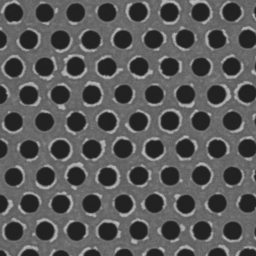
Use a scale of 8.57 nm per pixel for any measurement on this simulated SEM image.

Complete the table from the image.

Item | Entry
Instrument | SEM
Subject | a regular array of holes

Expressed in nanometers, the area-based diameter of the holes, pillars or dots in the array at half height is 158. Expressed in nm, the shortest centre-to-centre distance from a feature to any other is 264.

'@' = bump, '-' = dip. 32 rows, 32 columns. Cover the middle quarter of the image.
@----@@@-----@@@@----@@@-----@@@
@----@@@@----@@@@----@@@-----@@@
@@--@@@@@---@@@@@@--@@@@@---@@@@
@@@@@@@@@@@@@@@@@@@@@@@@@@@@@@@@
@@@@@@@@@@@@@@@@@@@@@@@@@@@@@@@@
@@@@@@--@@@@@@--@@@@@---@@@@@--@
-@@@@----@@@@----@@@-----@@@----
-@@@@----@@@-----@@@-----@@@----
-@@@@----@@@@----@@@-----@@@----
@@@@@---@@@@@@--@@@@@---@@@@@---
@@@@@@@@@@@@@@@@@@@@@@@@@@@@@@@@
@@@@@@@@@@@@@@@@@@@@@@@@@@@@@@@@
@@--@@@@@@--@@@@@@--@@@@@---@@@@
@----@@@@----@@@@----@@@-----@@@
@----@@@-----@@@-----@@@-----@@@
@----@@@@----@@@@----@@@-----@@@
@@--@@@@@@--@@@@@---@@@@@@-@@@@@
@@@@@@@@@@@@@@@@@@@@@@@@@@@@@@@@
@@@@@@@@@@@@@@@@@@@@@@@@@@@@@@@@
@@@@@@--@@@@@---@@@@@---@@@@@---
-@@@@----@@@-----@@@-----@@@----
-@@@@----@@@-----@@@-----@@@----
-@@@@----@@@@----@@@@----@@@----
@@@@@@--@@@@@@-@@@@@@@-@@@@@@@-@
@@@@@@@@@@@@@@@@@@@@@@@@@@@@@@@@
@@@@@@@@@@@@@@@@@@@@@@@@@@@@@@@@
@----@@@@---@@@@@---@@@@@---@@@@
@----@@@@----@@@-----@@@-----@@@
@----@@@-----@@@-----@@@-----@@@
@----@@@@----@@@@---@@@@@---@@@@
@@@@@@@@@@@@@@@@@@@@@@@@@@@@@@@@
@@@@@@@@@@@@@@@@@@@@@@@@@@@@@@@@